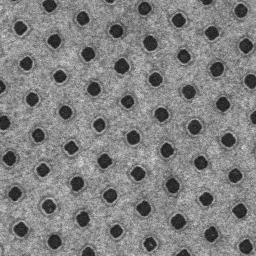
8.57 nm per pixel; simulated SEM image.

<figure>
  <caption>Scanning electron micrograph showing a regular array of holes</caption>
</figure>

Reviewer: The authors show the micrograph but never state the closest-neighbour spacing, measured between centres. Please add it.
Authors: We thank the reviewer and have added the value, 305 nm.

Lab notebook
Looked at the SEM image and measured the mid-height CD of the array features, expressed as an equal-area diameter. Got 126 nm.